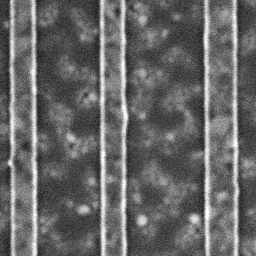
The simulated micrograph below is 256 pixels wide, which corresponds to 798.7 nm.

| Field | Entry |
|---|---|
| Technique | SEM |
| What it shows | one or a few lines or trenches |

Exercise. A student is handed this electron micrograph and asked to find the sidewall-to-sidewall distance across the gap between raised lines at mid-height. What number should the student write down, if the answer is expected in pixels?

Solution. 67.3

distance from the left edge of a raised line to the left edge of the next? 309 nanometres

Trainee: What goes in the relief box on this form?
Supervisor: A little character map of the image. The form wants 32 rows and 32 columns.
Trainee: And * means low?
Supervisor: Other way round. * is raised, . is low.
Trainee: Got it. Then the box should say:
.***.........**...........***...
.***.........**...........***...
.***.........**...........***...
.***.........**...........***...
.***.........**...........***...
.***.........**...........***...
..**.........**...........***...
.***.........**...........***...
.***.........***..........****..
.***.........***..........****..
..**.........***..........***...
.***.........***..........***...
.***.........***..........***...
.***.........***..........***...
.***.........***..........***...
.***.........***..........***...
.***.........***..........****..
.***.........***..........****..
..**.........***..........****..
.***.........***..........****..
.***.........***..........****..
.***.........***..........****..
.***.........***..........***...
..**.........***..........****..
..**.........**...........****..
.***.........**...........****..
.***......*..**...........****..
.***.........***.*......*.****..
.***.........**...........****..
.***.........***..........****..
..**.........***..........****..
..**.........***..........***...